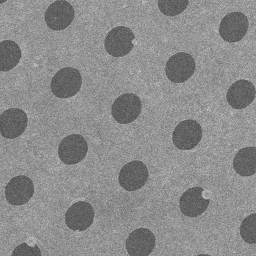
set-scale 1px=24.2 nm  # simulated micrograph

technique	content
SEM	a regular array of holes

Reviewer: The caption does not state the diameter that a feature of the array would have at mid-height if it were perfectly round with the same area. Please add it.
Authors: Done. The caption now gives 0.751 micrometres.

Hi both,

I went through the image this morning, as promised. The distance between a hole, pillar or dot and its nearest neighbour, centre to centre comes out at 1600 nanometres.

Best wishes